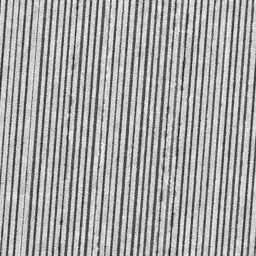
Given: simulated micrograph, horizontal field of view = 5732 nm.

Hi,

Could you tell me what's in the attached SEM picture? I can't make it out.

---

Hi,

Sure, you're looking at parallel lines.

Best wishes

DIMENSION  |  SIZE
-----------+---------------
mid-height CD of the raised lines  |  92.1 nm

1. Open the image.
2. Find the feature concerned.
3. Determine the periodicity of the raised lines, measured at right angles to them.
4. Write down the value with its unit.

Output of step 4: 6.49 pixels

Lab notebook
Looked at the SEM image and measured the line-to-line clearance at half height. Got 0.0558 µm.